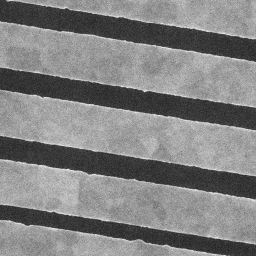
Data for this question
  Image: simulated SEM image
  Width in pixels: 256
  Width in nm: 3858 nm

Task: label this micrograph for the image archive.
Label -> one or a few lines or trenches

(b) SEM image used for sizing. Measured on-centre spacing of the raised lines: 1020 nanometres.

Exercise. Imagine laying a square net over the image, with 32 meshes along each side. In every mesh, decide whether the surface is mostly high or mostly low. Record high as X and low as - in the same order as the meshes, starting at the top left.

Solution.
----XXXXXXXXXXXXXXXXXXXXXXXXXXXX
-----------XXXXXXXXXXXXXXXXXXXXX
-----------------XXXXXXXXXXXXXXX
XXXXX-------------------XXXXXXXX
XXXXXXXXXXXX------------------XX
XXXXXXXXXXXXXXXXXX--------------
XXXXXXXXXXXXXXXXXXXXXXXX--------
XXXXXXXXXXXXXXXXXXXXXXXXXXXXXXX-
-XXXXXXXXXXXXXXXXXXXXXXXXXXXXXXX
-------XXXXXXXXXXXXXXXXXXXXXXXXX
-------------XXXXXXXXXXXXXXXXXXX
XX-----------------XXXXXXXXXXXXX
XXXXXXXX------------------XXXXXX
XXXXXXXXXXXXXX------------------
XXXXXXXXXXXXXXXXXXXX------------
XXXXXXXXXXXXXXXXXXXXXXXXXXX-----
XXXXXXXXXXXXXXXXXXXXXXXXXXXXXXXX
---XXXXXXXXXXXXXXXXXXXXXXXXXXXXX
----------XXXXXXXXXXXXXXXXXXXXXX
----------------XXXXXXXXXXXXXXXX
XXXX------------------XXXXXXXXXX
XXXXXXXXXX-------------------XXX
XXXXXXXXXXXXXXXXX---------------
XXXXXXXXXXXXXXXXXXXXXXX---------
XXXXXXXXXXXXXXXXXXXXXXXXXXXXX---
XXXXXXXXXXXXXXXXXXXXXXXXXXXXXXXX
-------XXXXXXXXXXXXXXXXXXXXXXXXX
-------------XXXXXXXXXXXXXXXXXXX
XXXXXXX------------XXXXXXXXXXXXX
XXXXXXXXXXXXX------------XXXXXXX
XXXXXXXXXXXXXXXXXXX-------------
XXXXXXXXXXXXXXXXXXXXXXXXX-------